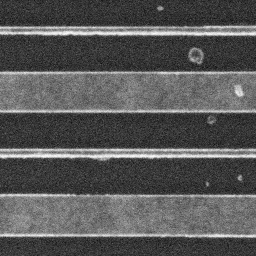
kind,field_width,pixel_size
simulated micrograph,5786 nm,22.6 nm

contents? lines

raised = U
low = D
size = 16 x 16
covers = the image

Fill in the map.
DDDDDDDDDDDDDDDD
DDDDDDDDDDDDDDDD
DDDDDDDDDDDDDDDD
DDDDDDDDDDDDDDDD
DDDDDDDDDDDDDDDD
UUUUUUUUUUUUUUUU
UUUUUUUUUUUUUUUU
DDDDDDDDDDDDDDDD
DDDDDDDDDDDDDDDD
DDDDDDDDDDDDDDDD
DDDDDDDDDDDDDDDD
DDDDDDDDDDDDDDDD
UUUUUUUUUUUUUUUU
UUUUUUUUUUUUUUUU
UUUUUUUUUUUUUUUU
DDDDDDDDDDDDDDDD